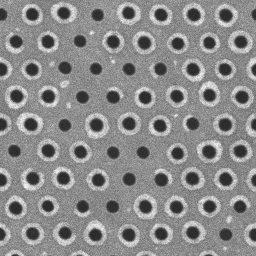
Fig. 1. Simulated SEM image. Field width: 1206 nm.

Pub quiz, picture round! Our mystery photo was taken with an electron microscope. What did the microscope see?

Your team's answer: a regular array of holes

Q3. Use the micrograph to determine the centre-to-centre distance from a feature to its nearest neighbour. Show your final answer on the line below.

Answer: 0.144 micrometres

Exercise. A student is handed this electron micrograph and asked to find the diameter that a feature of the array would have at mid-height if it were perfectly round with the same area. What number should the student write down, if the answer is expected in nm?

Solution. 61.4